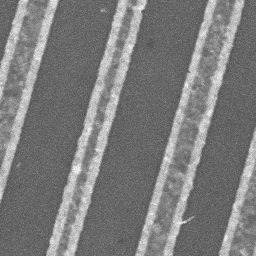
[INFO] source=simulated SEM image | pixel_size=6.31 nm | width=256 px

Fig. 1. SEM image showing one or a few lines or trenches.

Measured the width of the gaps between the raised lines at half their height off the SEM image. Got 0.428 um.